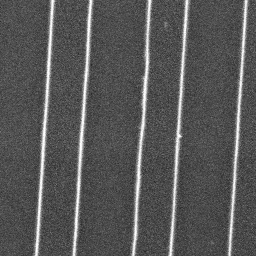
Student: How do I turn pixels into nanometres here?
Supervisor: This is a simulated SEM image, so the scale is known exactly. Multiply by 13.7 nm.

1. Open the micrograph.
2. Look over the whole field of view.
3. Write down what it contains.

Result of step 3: one or a few lines or trenches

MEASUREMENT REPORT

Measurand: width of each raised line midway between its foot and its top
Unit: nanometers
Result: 510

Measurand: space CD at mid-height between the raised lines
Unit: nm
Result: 800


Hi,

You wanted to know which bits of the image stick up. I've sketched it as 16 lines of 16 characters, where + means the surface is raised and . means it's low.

...+++...+++...+
...+++...+++...+
...+++...+++...+
...++....++....+
...++....++....+
...++....++....+
...++....++....+
...++....++....+
...++....++....+
...++....++....+
...++....++....+
...++....++....+
...++....++....+
..+++...+++...++
..+++...+++...++
..+++...+++...++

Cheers